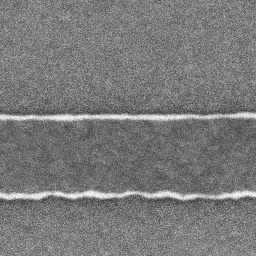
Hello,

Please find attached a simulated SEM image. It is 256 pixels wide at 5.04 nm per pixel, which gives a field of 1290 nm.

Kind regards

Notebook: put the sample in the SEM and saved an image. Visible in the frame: one or a few lines or trenches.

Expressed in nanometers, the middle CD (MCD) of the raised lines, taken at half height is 401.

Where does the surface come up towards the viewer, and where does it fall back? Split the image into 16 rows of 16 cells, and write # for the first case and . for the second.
................
................
................
................
................
................
................
################
################
################
################
################
................
................
................
................